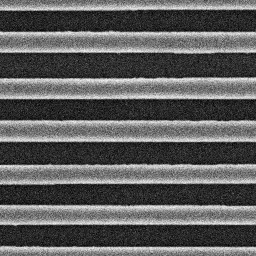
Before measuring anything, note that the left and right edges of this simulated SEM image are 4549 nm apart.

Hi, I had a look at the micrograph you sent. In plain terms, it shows lines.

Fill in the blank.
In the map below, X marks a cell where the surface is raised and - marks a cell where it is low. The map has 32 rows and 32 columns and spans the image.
XXXXXXXXXXXXXXXXXXXXXXXXXXXXXXXX
--------------------------------
--------------------------------
--------------------------------
XXXXXXXXXXXXXXXXXXXXXXXXXXXXXXXX
XXXXXXXXXXXXXXXXXXXXXXXXXXXXXXXX
------------------------XX------
--------------------------------
--------------------------------
--------------------------------
XXXXXXXXXXXXXXXXXXXXXXXXXXXXXXXX
XXXXXXXXXXXXXXXXXXXXXXXXXXXXXXXX
--------------------------------
--------------------------------
--------------------------------
XXXXXXXXXXXXXXXXXXXXXXXXXXXXXXXX
XXXXXXXXXXXXXXXXXXXXXXXXXXXXXXXX
XXXXXXXXXXXXXXXXXXXXXXXXXXXXXXXX
--------------------------------
--------------------------------
--------------------------------
XXXXXXXXXXXXXXXXXXXXXXXXXXXXXXXX
XXXXXXXXXXXXXXXXXXXXXXXXXXXXXXXX
--------------------------------
--------------------------------
--------------------------------
XXXXXXXXXXXXXXXXXXXXXXXXXXXXXXXX
XXXXXXXXXXXXXXXXXXXXXXXXXXXXXXXX
--------------------------------
--------------------------------
--------------------------------
XXXXXXXXXXXXXXXXXXXXXXXXXXXXXXXX